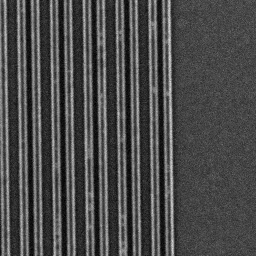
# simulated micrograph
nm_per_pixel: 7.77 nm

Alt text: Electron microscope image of parallel lines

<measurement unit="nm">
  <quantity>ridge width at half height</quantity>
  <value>45.7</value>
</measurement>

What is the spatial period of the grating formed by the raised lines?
127 nm